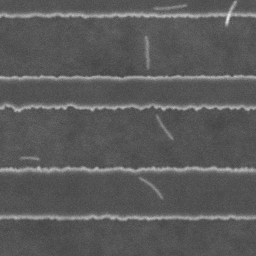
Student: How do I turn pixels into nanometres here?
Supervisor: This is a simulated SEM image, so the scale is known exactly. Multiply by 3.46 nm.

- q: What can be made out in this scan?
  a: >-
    lines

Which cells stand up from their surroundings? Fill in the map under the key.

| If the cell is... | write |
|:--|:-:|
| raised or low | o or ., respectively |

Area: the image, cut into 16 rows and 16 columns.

oooooooooooooooo
................
................
................
................
oooooooooooooooo
oooooooooooooooo
................
................
................
....o...........
oooooooooooooooo
oooooooooooooooo
oooooooooooooooo
................
................